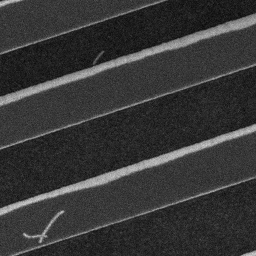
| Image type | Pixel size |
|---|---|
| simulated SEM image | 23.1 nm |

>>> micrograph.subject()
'lines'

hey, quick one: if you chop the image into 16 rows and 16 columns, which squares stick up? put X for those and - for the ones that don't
XXXXXXXXX-------
XXXXXX---------X
XXX--------XXXXX
--------XXXXXXXX
-----XXXXXXXXXX-
--XXXXXXXXXX----
XXXXXXXXX-------
XXXXXX----------
XXX-----------XX
-----------XXXXX
--------XXXXXXXX
-----XXXXXXXXXX-
--XXXXXXXXXX----
XXXXXXXXX-------
XXXXXX----------
XX--------------